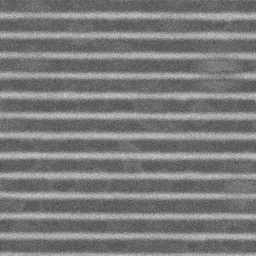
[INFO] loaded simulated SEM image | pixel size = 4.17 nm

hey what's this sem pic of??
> parallel lines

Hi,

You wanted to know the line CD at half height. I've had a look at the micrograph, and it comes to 0.0193 um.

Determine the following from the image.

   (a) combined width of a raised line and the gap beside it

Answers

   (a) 83.5 nanometres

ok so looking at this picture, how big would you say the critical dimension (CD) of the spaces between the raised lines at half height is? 0.062 µm